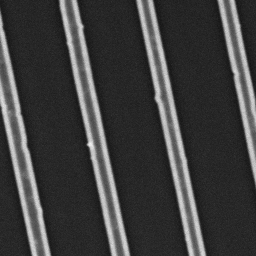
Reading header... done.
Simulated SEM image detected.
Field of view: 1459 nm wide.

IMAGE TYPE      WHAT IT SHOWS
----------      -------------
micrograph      one or a few lines or trenches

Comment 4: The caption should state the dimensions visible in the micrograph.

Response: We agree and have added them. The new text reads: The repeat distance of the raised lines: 77 px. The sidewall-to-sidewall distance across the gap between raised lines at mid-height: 0.363 microns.